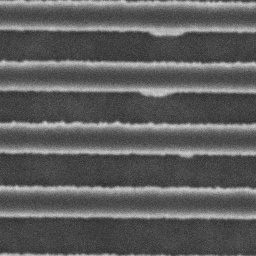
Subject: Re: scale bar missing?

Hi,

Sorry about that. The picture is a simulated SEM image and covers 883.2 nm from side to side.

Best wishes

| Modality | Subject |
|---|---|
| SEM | lines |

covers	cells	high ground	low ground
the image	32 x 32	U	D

UUUUUUUUUUUUUUUUUUUUUUUUUUUUUUUU
UUUUUUUUUUUUUUUUUUUUUUUUUUUUUUUU
UUUUUUUUUUUUUUUUUUUUUUUUUUUUUUUU
UUUUUUUUUUUUUUUUUUUUUUUUUUUUUUUU
DDDDDDDDDDDDDDDDDDDDDDDDDDDDDDDD
DDDDDDDDDDDDDDDDDDDDDDDDDDDDDDDD
DDDDDDDDDDDDDDDDDDDDDDDDDDDDDDDD
DDDDDDDDDDDDDDDDDDDDDDDDDDDDDDDD
UUUUUUUUUUUUUUUUUUUUUUUUUUUUUUUU
UUUUUUUUUUUUUUUUUUUUUUUUUUUUUUUU
UUUUUUUUUUUUUUUUUUUUUUUUUUUUUUUU
DDDDDDDDDDDDDDDDDDDDDDDDDDDDDDDD
DDDDDDDDDDDDDDDDDDDDDDDDDDDDDDDD
DDDDDDDDDDDDDDDDDDDDDDDDDDDDDDDD
DDDDDDDDDDDDDDDDDDDDDDDDDDDDDDDD
UUUUUUUUUUUUUUUDDDUDDDDDDDDDDDDD
UUUUUUUUUUUUUUUUUUUUUUUUUUUUUUUU
UUUUUUUUUUUUUUUUUUUUUUUUUUUUUUUU
UUUUUUUUUUUUUUUUUUUUUUUUUUUUUUUU
DDDDDDDDDDDDDDDDDDDDDDDDDDDDDDDD
DDDDDDDDDDDDDDDDDDDDDDDDDDDDDDDD
DDDDDDDDDDDDDDDDDDDDDDDDDDDDDDDD
DDDDDDDDDDDDDDDDDDDDDDDDDDDDDDDD
UUUUUUUUUUUUUDUUDDUUDDDUDDDDDDDD
UUUUUUUUUUUUUUUUUUUUUUUUUUUUUUUU
UUUUUUUUUUUUUUUUUUUUUUUUUUUUUUUU
UUUUUUUUUUUUUUUUUUUUUUUUUUUUUUUU
DDDDDDDDDDDDDDDDDDDDDDDDDDDDDDDD
DDDDDDDDDDDDDDDDDDDDDDDDDDDDDDDD
DDDDDDDDDDDDDDDDDDDDDDDDDDDDDDDD
DDDDDDDDDDDDDDDDDDDDDDDDDDDDDDDD
DDDDDDDDDDDDDDDDDDDDDDDDDDDDDDDD